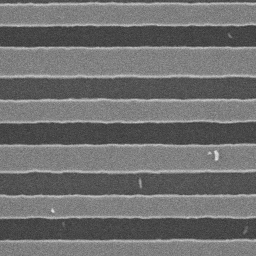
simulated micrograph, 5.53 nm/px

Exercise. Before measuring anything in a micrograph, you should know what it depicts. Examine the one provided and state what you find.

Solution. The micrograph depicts lines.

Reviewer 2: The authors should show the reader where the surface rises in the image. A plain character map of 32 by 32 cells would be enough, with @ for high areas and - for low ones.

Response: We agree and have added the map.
@@@@@@@@@@@@@@@@@@@@@@@@@@@@@@@@
@@@@@@@@@@@@@@@@@@@@@@@@@@@@@@@@
@@@@@@@@@@@@@@@@@@@@@@@@@@@@@@@@
--------------------------------
--------------------------------
--------------------------------
@@@@@@@@@@@@@@@@@@@@@@@@@@@@@@@@
@@@@@@@@@@@@@@@@@@@@@@@@@@@@@@@@
@@@@@@@@@@@@@@@@@@@@@@@@@@@@@@@@
@@@@@@@@@@@@@@@@@@@@@@@@@@@@@-@@
--------------------------------
--------------------------------
-----@@-@@@@@@@@@@@@@@@-@@@@@@@@
@@@@@@@@@@@@@@@@@@@@@@@@@@@@@@@@
@@@@@@@@@@@@@@@@@@@@@@@@@@@@@@@@
--------------------------------
--------------------------------
--------------------------------
@@@@@@@@@@@@@@@@@@@@@@@@@@@@@@@@
@@@@@@@@@@@@@@@@@@@@@@@@@@@@@@@@
@@@@@@@@@@@@@@@@@@@@@@@@@@@@@@@@
@@@@--@@-@@@@@@@@@@@@@-@@-------
--------------------------------
--------------------------------
@@@@@@@@@@@@@@@@@@@@@@@@@@@@@@@@
@@@@@@@@@@@@@@@@@@@@@@@@@@@@@@@@
@@@@@@@@@@@@@@@@@@@@@@@@@@@@@@@@
--------------------------------
--------------------------------
--------------------------------
@@@@@@@@@@@@@@@@@@@@@@@@@@@@@@@@
@@@@@@@@@@@@@@@@@@@@@@@@@@@@@@@@